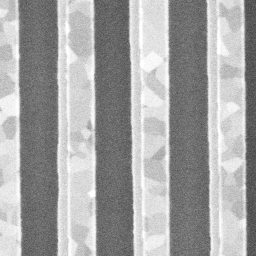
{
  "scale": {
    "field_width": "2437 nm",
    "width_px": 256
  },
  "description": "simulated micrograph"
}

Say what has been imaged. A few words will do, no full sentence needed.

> lines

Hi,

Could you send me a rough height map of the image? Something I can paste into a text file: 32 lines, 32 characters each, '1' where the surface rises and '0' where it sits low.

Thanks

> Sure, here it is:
11000001111100001111100000111100
11000001111100001111100000111100
11000001111100001111100000111100
11000001111100001111100000111100
11000001111100001111100000111100
11000001111100001111100000111100
11000001111100001111100000111100
11000001111100001111100000111110
11000001111100000111100000111110
11000001111100000111100000111110
11000001111100000111100000111110
11000001111100000111100000111110
11000001111100000111100000111110
11000001111100000111100000111110
11000001111100000111100000111110
11000001111100000111100000111110
11000001111100000111100000111110
11000001111100000111100000111110
11000001111100000111100000111110
11000001111100000111100000111110
11000001111100000111100000111110
11000001111100000111100000111110
11000001111100000111100000111110
11000001111100000111100000111110
11000001111100000111100000111110
11000001111100000111100000111110
11000001111100000111100000111110
11000001111100000111100000111110
11000001111100000111100000111110
11000001111100000111100000111110
11000001111100000111100000011110
11000001111100000111100000111110